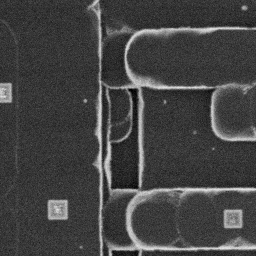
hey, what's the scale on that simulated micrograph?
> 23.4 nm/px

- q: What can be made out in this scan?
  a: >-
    wiring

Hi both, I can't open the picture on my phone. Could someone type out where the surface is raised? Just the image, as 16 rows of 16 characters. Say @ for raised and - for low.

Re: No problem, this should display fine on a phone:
@@@@@@----------
@@@@@@----------
@@@@@@--@@@@@@@@
@@@@@@--@@@@@@@@
@@@@@@--@@@@@@@@
@@@@@@-------@@@
@@@@@@-------@@@
@@@@@@-------@@@
@@@@@@--------@@
@@@@@@----------
@@@@@@----------
@@@@@@----------
@@@@@@--@@@@@@@@
@@@@@@--@@@@@@-@
@@@@@@--@@@@@@@@
@@@@@@---@@@@@@-